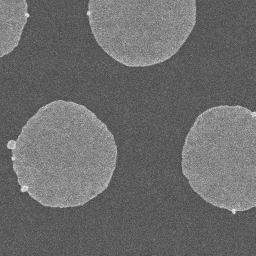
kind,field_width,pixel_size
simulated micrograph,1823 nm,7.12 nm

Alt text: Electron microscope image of raised bodies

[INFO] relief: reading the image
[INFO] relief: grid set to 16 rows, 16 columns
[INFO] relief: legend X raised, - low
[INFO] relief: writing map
XX----XXXXXX----
XX----XXXXXX----
X-----XXXXXX----
-------XXXX-----
----------------
----------------
---XX-----------
--XXXX------XXXX
-XXXXXX-----XXXX
-XXXXXX----XXXXX
-XXXXXX----XXXXX
-XXXXXX-----XXXX
--XXXX-------XXX
----------------
----------------
----------------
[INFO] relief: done